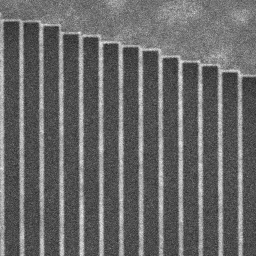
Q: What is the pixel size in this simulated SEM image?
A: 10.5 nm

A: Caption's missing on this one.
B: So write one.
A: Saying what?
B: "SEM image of parallel lines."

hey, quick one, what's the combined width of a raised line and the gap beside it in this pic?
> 209 nm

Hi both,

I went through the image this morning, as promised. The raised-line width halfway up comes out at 0.0356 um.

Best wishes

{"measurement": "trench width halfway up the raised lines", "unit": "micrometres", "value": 0.173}